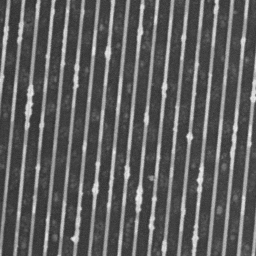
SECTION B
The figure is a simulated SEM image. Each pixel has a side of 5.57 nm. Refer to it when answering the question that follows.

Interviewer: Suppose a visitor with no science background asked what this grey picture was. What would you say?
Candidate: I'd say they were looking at parallel lines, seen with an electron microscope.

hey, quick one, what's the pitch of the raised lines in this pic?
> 82.6 nm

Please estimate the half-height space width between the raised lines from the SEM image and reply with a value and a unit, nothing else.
0.0651 microns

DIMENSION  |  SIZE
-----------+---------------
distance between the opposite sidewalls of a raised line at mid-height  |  15.2 nm